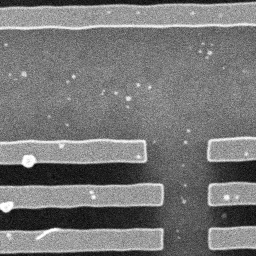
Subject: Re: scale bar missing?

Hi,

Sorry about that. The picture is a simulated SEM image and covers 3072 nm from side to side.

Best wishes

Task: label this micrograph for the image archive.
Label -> groups of lines, slits or small figures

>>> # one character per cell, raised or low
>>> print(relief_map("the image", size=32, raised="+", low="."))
............................++++
++++++++++++++++++++++++++++++++
++++++++++++++++++++++++++++++++
+.++....+++.....................
................................
................................
................................
................................
................................
................................
................................
................................
................................
................................
................................
................................
................................
...........+++.............+++++
++++++++++++++++++........++++++
++++++++++++++++++........++++++
++++............................
................................
................................
++++++++++++++++++++......++++++
++++++++++++++++++++......++++++
++++++++++++++++++++......++++++
................................
................................
............................++++
++++++++++++++++++++......++++++
++++++++++++++++++++......++++++
+++.............................